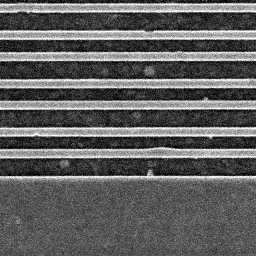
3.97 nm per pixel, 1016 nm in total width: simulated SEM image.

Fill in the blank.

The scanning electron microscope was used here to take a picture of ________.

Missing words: parallel lines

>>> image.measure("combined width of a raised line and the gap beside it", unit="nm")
96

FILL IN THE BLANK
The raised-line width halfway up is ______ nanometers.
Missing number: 32.2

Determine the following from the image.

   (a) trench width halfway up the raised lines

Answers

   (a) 0.0749 micrometres